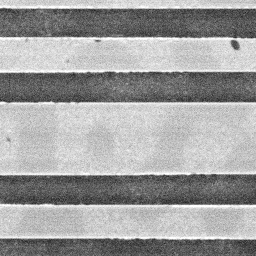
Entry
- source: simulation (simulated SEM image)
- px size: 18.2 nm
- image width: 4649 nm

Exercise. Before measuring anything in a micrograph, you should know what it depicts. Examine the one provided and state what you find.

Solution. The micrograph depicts lines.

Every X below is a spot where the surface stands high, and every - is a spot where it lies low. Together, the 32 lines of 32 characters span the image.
XXXXXXXXXXXXXXXXXXXXXXXXXXXXXXXX
--------------------------------
--------------------------------
--------------------------------
--------------------------------
XXXXXXXXXXXXXXXXXXXXXXXXXXXXXXXX
XXXXXXXXXXXXXXXXXXXXXXXXXXXXXXXX
XXXXXXXXXXXXXXXXXXXXXXXXXXXXXXXX
XXXXXXXXXXXXXXXXXXXXXXXXXXXXXXXX
--------------------------------
--------------------------------
--------------------------------
--------------------------------
XXXXXXXXXXXXXXXXXXXXXXXXXXXXXXXX
XXXXXXXXXXXXXXXXXXXXXXXXXXXXXXXX
XXXXXXXXXXXXXXXXXXXXXXXXXXXXXXXX
XXXXXXXXXXXXXXXXXXXXXXXXXXXXXXXX
XXXXXXXXXXXXXXXXXXXXXXXXXXXXXXXX
XXXXXXXXXXXXXXXXXXXXXXXXXXXXXXXX
XXXXXXXXXXXXXXXXXXXXXXXXXXXXXXXX
XXXXXXXXXXXXXXXXXXXXXXXXXXXXXXXX
XXXXXXXXXXXXXXXXXXXXXXXXXXXXXXXX
--------------------------------
--------------------------------
--------------------------------
--------------------------------
XXXXXXXXXXXXXXXXXXXXXXXXXXXXXXXX
XXXXXXXXXXXXXXXXXXXXXXXXXXXXXXXX
XXXXXXXXXXXXXXXXXXXXXXXXXXXXXXXX
XXXXXXXXXXXXXXXXXXXXXXXXXXXXXXXX
--------------------------------
--------------------------------